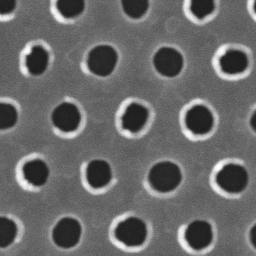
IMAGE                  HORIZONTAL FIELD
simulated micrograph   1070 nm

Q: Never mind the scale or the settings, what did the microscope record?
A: a regular array of holes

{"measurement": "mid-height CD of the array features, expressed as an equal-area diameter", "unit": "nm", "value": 124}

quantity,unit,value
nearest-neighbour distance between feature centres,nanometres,269